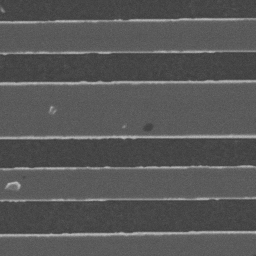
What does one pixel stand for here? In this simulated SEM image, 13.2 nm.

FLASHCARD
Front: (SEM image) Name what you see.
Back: lines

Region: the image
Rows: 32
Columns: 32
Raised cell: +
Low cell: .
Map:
................................
................................
................++++++++++++++++
++++++++++++++++++++++++++++++++
++++++++++++++++++++++++++++++++
++++++++++++++++++++++++++++++++
+++++++++++++++++++++++++++.....
................................
................................
................................
++++++++++++++++++++++++++++++++
++++++++++++++++++++++++++++++++
++++++++++++++++++++++++++++++++
++++++++++++++++++++++++++++++++
++++++++++++++++++++++++++++++++
++++++++++++++++++++++++++++++++
++++++++++++++++++++++++++++++++
................................
................................
................................
................................
++++++++++++++++++++++++++++++++
++++++++++++++++++++++++++++++++
++++++++++++++++++++++++++++++++
++++++++++++++++++++++++++++++++
................................
................................
................................
................................
++++++++++++++++++++++++++++++++
++++++++++++++++++++++++++++++++
++++++++++++++++++++++++++++++++